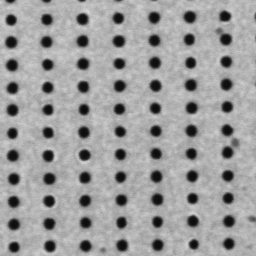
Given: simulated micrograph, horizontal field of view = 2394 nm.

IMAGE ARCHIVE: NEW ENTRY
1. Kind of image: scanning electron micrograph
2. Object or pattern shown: a regular array of holes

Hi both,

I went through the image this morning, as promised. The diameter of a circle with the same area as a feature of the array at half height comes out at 113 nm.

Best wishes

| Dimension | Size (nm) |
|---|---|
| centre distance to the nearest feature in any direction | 210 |